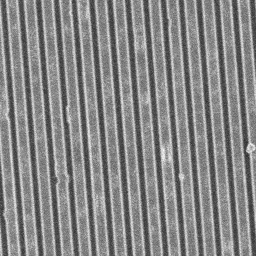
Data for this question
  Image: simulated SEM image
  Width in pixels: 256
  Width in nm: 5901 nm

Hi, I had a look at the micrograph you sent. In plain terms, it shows parallel lines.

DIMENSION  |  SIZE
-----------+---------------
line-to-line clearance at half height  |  161 nm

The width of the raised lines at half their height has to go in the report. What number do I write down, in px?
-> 11.3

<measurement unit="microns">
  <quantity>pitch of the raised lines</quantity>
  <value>0.409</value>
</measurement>